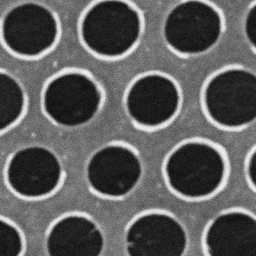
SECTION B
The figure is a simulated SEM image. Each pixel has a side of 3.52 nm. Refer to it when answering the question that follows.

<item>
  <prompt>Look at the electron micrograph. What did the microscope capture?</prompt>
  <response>holes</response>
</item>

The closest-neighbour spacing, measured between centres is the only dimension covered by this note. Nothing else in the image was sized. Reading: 285 nanometres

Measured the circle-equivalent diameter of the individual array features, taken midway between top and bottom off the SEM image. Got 186 nanometres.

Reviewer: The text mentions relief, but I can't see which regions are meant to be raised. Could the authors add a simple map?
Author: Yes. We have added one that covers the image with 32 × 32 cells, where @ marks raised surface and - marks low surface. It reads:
@@@-@@@@@@@@----@@@@@@@---@@@@@@
@-----@@@@@------@@@@------@@@@-
@------@@@@------@@@@------@@@@-
-------@@@-------@@@@-------@@@-
-------@@@-------@@@@------@@@@-
@-----@@@@@------@@@@------@@@@@
@@---@@@@@@@----@@@@@@@--@@@@@@@
@@@@@@@@@@@@@@@@@@@@@@@@@@@@@@@@
@@@@@@@@@@@@@@@@@@@@@@@@@@@@@@@@
-@@@@@@@---@@@@@@@@-@@@@@@@-----
--@@@@------@@@@@-----@@@@------
---@@@------@@@@------@@@@------
---@@@-------@@@------@@@@------
---@@@------@@@@------@@@@------
--@@@@------@@@@-----@@@@@------
-@@@@@@@--@@@@@@@@--@@@@@@@@--@@
@@@@@@@@@@@@@@@@@@@@@@@@@@@@@@@@
@@@@@@@@@@@@@@@@@@@@@@@@@@@@@@@@
@@@@-@@@@@@@@--@@@@@@@@----@@@@@
@@-----@@@@@-----@@@@------@@@@-
@------@@@@------@@@@-------@@@-
@------@@@@-------@@@-------@@@-
@------@@@@------@@@@-------@@@-
@@-----@@@@@----@@@@@@-----@@@@@
@@@-@@@@@@@@@@-@@@@@@@@--@@@@@@@
@@@@@@@@@@@@@@@@@@@@@@@@@@@@@@@@
@@@@@@@@@@@@@@@@@@@@@@@@@@@@@@@@
@@@@@@@@---@@@@@@-----@@@@@-----
--@@@@@-----@@@@-------@@@------
--@@@@-------@@@-------@@@------
---@@@-------@@@-------@@@------
---@@@-------@@@-------@@@------